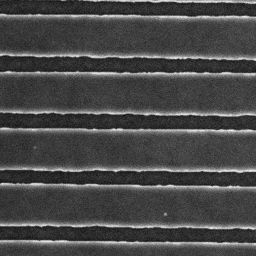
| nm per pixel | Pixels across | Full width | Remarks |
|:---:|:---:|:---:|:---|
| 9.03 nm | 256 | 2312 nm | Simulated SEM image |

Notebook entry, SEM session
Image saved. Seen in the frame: lines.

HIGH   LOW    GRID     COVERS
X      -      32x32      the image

--------------------------------
--------------------------------
XXXXXXXXXXXXXXXXXXXXXXXXXXXXXXXX
XXXXXXXXXXXXXXXXXXXXXXXXXXXXXXXX
XXXXXXXXXXXXXXXXXXXXXXXXXXXXXXXX
XXXXXXXXXXXXXXXXXXXXXXXXXXXXXXXX
XXXXXXXXXXXXXXXXXXXXXXXXXXXXXXXX
--------------------------------
--------------------------------
XXXXXXXXXXXXXXXXXXXXXXXXXXXXXXXX
XXXXXXXXXXXXXXXXXXXXXXXXXXXXXXXX
XXXXXXXXXXXXXXXXXXXXXXXXXXXXXXXX
XXXXXXXXXXXXXXXXXXXXXXXXXXXXXXXX
XXXXXXXXXXXXXXXXXXXXXXXXXXXXXXXX
--------------------------------
--------------------------------
XXXXXXXXXXXXXXXXXXXXXXXXXXXXXXXX
XXXXXXXXXXXXXXXXXXXXXXXXXXXXXXXX
XXXXXXXXXXXXXXXXXXXXXXXXXXXXXXXX
XXXXXXXXXXXXXXXXXXXXXXXXXXXXXXXX
XXXXXXXXXXXXXXXXXXXXXXXXXXXXXXXX
------------------------------X-
--------------------------------
XXXXXXXXXXXXXXXXXXXXXXXXXXXXXXXX
XXXXXXXXXXXXXXXXXXXXXXXXXXXXXXXX
XXXXXXXXXXXXXXXXXXXXXXXXXXXXXXXX
XXXXXXXXXXXXXXXXXXXXXXXXXXXXXXXX
XXXXXXXXXXXXXXXXXXXXXXXXXXXXXXXX
--------------------------XXXXXX
--------------------------------
XXXXXXXXXXXXXXXXXXXXXXXXXXXXXXXX
XXXXXXXXXXXXXXXXXXXXXXXXXXXXXXXX